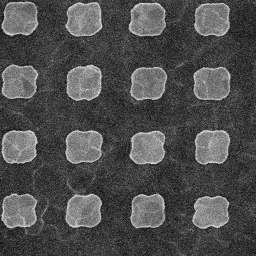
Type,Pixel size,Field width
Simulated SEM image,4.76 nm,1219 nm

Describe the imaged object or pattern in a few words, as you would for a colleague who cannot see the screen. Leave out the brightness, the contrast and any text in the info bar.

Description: a regular array of raised bodies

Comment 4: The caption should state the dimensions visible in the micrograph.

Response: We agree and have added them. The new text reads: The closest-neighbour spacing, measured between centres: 0.302 microns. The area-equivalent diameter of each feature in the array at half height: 171 nm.